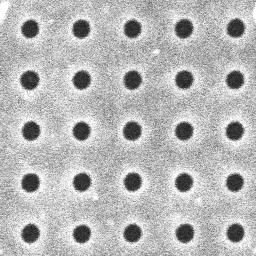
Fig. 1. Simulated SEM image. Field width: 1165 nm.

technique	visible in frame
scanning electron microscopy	a regular array of holes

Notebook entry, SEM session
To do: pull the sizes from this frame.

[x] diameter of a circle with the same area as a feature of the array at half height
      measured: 87.8 nm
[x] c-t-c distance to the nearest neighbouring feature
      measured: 0.231 microns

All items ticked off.